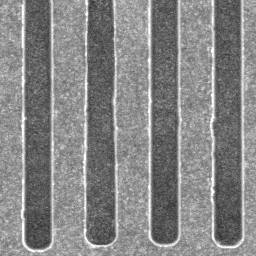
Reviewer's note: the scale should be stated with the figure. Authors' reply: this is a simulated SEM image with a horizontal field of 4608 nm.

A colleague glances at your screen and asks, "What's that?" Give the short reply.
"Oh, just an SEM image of one or a few lines or trenches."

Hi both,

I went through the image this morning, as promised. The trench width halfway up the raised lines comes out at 0.518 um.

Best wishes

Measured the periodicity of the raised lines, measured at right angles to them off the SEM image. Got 1140 nm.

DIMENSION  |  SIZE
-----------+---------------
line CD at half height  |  621 nm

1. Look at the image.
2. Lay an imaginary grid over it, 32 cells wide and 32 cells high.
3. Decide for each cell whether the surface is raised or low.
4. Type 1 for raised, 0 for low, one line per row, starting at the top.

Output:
11100011111000111110001111100011
11100001111000111110001111100011
11100001111000111110001111100011
11100001111000111110001111100011
11100001111000111110001111100011
11100001111000111110001111100011
11100001111000111110001111100011
11100001111000111110001111100011
11100001111000111110001111100011
11100001111000111110001111100011
11100001111000111110001111100011
11100001111000111110001111100011
11100001111000111110001111100011
11100001111000111110001111100011
11100001111000111110001111100011
11100001111000111110000111000011
11100001111000111110001111000011
11100001111000111110001111100011
11100001111000111110001111100011
11100001111000111110001111100011
11100001111000111110001111100011
11100001111000011110001111100011
11100001111000011110001111100011
11100001111000011110001111100011
11100001111000011110001111100011
11100001111000011110001111100011
11100001111000011110001111100011
11100001111000011110001111100011
11100001111000011110001111100011
11100001111000011110001111100011
11100011111100111111001111100011
11111111111111111111111111111111